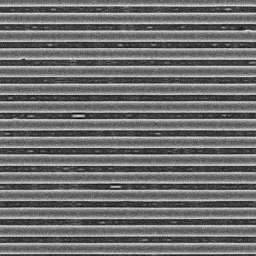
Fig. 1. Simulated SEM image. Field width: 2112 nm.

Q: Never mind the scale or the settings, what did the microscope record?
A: parallel lines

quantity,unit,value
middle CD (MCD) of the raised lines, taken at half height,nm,92.9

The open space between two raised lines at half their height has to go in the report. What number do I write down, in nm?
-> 57.8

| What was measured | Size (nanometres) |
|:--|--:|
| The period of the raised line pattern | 146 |